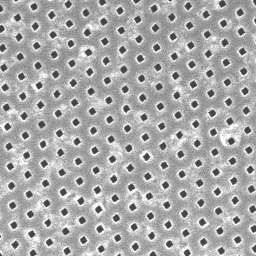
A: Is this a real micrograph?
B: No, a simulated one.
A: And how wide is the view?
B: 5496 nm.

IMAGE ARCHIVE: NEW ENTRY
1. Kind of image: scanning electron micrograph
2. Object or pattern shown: a regular array of holes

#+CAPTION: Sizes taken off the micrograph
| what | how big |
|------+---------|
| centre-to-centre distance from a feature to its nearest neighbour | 0.419 microns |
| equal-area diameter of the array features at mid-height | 157 nm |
